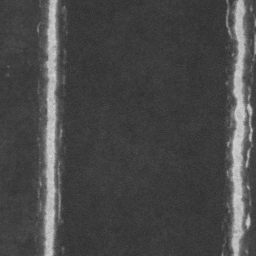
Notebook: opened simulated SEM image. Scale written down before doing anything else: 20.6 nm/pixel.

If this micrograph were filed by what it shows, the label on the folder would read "one or a few lines or trenches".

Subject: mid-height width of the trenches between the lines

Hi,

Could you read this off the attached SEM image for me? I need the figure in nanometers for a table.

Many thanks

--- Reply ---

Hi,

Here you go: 3870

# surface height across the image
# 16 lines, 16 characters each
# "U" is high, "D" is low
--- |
UUUDDDDDDDDDDDDU
UUUDDDDDDDDDDDDU
UUUDDDDDDDDDDDDU
UUUDDDDDDDDDDDDU
UUUDDDDDDDDDDDDU
UUUDDDDDDDDDDDDU
UUUDDDDDDDDDDDDU
UUUDDDDDDDDDDDDU
UUUDDDDDDDDDDDDU
UUUDDDDDDDDDDDDU
UUUDDDDDDDDDDDDU
UUUDDDDDDDDDDDDU
UUUDDDDDDDDDDDDU
UUUDDDDDDDDDDDDU
UUUDDDDDDDDDDDDU
UUUDDDDDDDDDDDDU